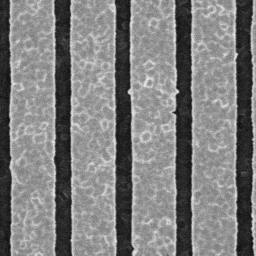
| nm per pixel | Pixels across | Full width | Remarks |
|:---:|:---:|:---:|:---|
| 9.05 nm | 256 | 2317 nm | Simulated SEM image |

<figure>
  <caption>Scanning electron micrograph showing parallel lines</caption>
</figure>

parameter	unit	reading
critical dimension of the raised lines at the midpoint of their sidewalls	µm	0.389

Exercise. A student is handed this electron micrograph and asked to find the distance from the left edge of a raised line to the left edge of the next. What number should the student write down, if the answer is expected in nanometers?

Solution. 548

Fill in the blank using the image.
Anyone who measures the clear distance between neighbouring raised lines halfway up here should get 0.154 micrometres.